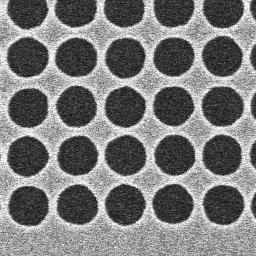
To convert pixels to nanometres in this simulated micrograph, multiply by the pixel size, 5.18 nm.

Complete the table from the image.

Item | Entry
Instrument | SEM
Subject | a regular array of holes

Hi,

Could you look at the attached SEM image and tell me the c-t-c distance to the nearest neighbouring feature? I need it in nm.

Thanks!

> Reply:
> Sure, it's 250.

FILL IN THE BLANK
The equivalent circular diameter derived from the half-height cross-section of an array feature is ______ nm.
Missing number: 214